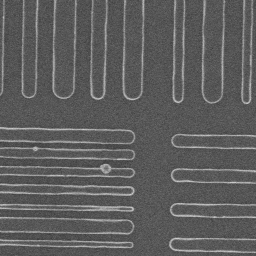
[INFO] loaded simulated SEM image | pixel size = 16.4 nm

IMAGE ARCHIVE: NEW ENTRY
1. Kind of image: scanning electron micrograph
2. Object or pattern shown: groups of lines, slits or small figures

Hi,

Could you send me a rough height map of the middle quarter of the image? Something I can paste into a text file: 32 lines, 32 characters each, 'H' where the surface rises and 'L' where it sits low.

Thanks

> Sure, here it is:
HHHLLLLHHHLLLLLHHHHHLLLLLLLLHHLL
HHHLLLLHHHLLLLLHHHHHLLLLLLLLHHLL
HHHLLLLHHHLLLLLHHHHHLLLLLLLLHHLL
HHHLLLLHHHLLLLLHHHHHLLLLLLLHHHLL
HHHLLLLHHHLLLLLHHHHHLLLLLLLHHHLL
HHHLLLLHHHLLLLLHHHHLLLLLLLLHHHLL
HHHLLLLHHHLLLLLHHHHLLLLLLLLHHHLL
HHLLLLLHHHLLLLLHHHHLLLLLLLLHHHLL
HLLLLLLLHLLLLLLLHHHLLLLLLLLLHHLL
LLLLLLLLLLLLLLLLLLLLLLLLLLLLHLLL
LLLLLLLLLLLLLLLLLLLLLLLLLLLLLLLL
LLLLLLLLLLLLLLLLLLLLLLLLLLLLLLLL
LLLLLLLLLLLLLLLLLLLLLLLLLLLLLLLL
LLLLLLLLLLLLLLLLLLLLLLLLLLLLLLLL
LLLLLLLLLLLLLLLLLLLLLLLLLLLLLLLL
LLLLLLLLLLLLLLLLLLLLLLLLLLLLLLLL
HHHLLLLLLLLLLLLLLLLLLLLLLLLLLLLL
HHHHHHHHHHHHHHHHHLLLLLLLLLLLLLLL
HHHHHHHHHHHHHHHHHHLLLLLLLLLHHHHH
LLLLLLLHHHHHHHHHHLLLLLLLLLLHHHHH
LLLLLLLLLLLLLLLLLLLLLLLLLLLLHHHH
HHHHHHHHHHHHLHHHHLLLLLLLLLLLLLLL
HHHHHHHHHHHHHHHHHHLLLLLLLLLLLLLL
HHHHHHHHHHHHHHHHHLLLLLLLLLLLLLLL
LLLLLLLLLLLLLLLLLLLLLLLLLLLLLLLL
LLLLLLLLLHHLLLLLLLLLLLLLLLLLLLLL
HHHHHHHHHHHHHHHHHLLLLLLLLLLLHHHH
HHHHHHHHHHHHHHHHHLLLLLLLLLLHHHHH
LLLLLLLLLLLLLLLLLLLLLLLLLLLHHHHH
LLLLLLLLLLLLLLLLLLLLLLLLLLLLLLLL
LLLLLLLLLLLLLLLLLLLLLLLLLLLLLLLL
HHHHHHHHHHHHHHHHHLLLLLLLLLLLLLLL